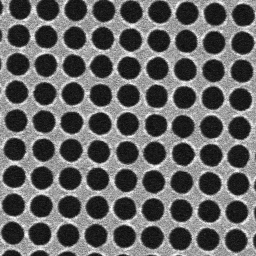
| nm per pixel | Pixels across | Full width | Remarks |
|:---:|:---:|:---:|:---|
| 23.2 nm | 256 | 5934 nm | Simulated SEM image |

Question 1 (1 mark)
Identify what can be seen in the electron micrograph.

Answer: a regular array of holes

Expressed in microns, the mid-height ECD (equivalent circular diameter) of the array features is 0.549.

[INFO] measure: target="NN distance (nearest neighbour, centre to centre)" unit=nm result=643